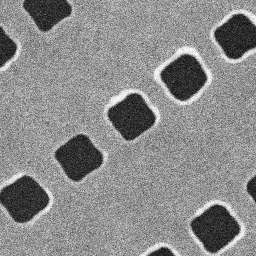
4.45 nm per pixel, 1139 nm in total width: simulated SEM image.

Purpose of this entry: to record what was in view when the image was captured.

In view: holes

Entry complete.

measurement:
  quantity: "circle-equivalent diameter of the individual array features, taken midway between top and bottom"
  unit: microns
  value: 0.192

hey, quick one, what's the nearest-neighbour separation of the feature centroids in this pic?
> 294 nm